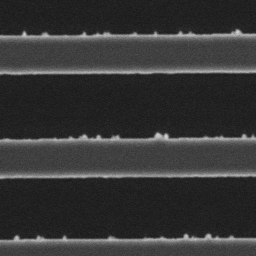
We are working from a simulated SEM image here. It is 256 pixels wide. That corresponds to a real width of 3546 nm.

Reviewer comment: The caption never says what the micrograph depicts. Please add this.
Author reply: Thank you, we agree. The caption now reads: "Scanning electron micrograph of lines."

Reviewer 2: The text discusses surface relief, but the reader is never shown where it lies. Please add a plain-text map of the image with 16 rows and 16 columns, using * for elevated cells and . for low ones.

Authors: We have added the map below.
................
................
****************
****************
****************
................
................
................
................
****************
****************
................
................
................
................
****************